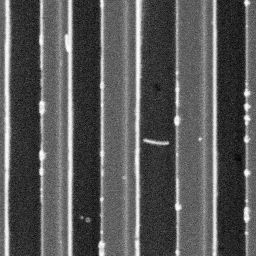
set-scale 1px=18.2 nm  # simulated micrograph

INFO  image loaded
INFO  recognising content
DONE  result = lines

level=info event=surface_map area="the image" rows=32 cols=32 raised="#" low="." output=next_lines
#....####....####.....#####....#
#....####....####.....#####....#
#....####....####.....#####....#
#....####....####.....#####....#
#....####....####.....#####....#
#....####....####.....#####....#
#....####....####.....#####....#
#....####....####.....#####....#
#....####....####.....#####....#
#....####....####.....#####....#
#....####....####.....#####....#
#....####....####.....#####....#
#....####....####.....#####....#
#....####....####.....#####....#
#....####....####.....#####....#
#....####....####.....#####....#
#....####....####.....#####....#
#....####....####.....#####....#
#....####....####.....#####....#
#....####....####.....#####....#
#....####....####.....#####....#
#....####....####.....#####....#
#....####....####.....#####....#
#....####....####.....#####....#
#....####....####.....#####....#
#....####....####.....#####....#
#....####....####.....#####....#
#....####....####.....#####....#
#....####....####.....#####....#
#....####....####.....#####....#
#....####...#####.....#####....#
#....####....####.....#####....#